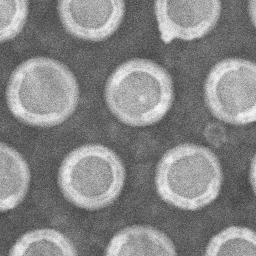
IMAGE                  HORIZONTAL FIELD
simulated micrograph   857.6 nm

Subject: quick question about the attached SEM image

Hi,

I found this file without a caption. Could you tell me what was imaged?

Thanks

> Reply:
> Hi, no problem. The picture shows raised bodies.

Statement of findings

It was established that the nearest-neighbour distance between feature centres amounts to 325 nm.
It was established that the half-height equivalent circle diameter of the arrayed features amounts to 207 nanometers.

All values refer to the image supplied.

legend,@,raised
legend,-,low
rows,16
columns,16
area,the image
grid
@@--@@@@--@@@@--
@---@@@---@@@---
----------------
----------------
-@@@---@@@---@@@
-@@@@--@@@@--@@@
-@@@@--@@@---@@@
--@@----@-----@@
----------------
@----@@----@@---
@@--@@@@--@@@@--
@@--@@@@--@@@@--
@----@@----@@---
----------------
--@-----@@----@@
-@@@---@@@@--@@@